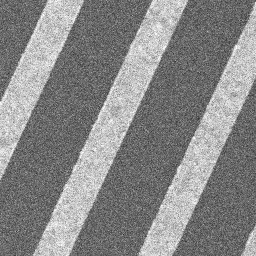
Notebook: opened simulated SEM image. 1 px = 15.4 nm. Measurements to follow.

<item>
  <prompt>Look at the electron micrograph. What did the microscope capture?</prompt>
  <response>one or a few lines or trenches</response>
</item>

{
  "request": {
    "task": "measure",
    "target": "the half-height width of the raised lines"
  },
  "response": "0.493 microns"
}